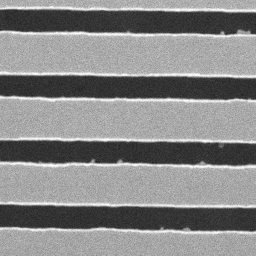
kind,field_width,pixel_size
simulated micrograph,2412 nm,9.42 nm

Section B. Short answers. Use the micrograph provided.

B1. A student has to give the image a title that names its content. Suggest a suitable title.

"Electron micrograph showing lines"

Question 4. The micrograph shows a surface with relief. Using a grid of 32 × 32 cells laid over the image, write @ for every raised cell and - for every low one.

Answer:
@@@@@@@@@@@@@@@@@@@@@@@@@@@@@@@@
----------------------------@---
--------------------------------
--------------------------------
@@@@@@@@@@@@@@@@@@@@@@@@@@@@@@@@
@@@@@@@@@@@@@@@@@@@@@@@@@@@@@@@@
@@@@@@@@@@@@@@@@@@@@@@@@@@@@@@@@
@@@@@@@@@@@@@@@@@@@@@@@@@@@@@@@@
@@@@@@@@@@@@@@@@@@@@@@@@@@@@@@@@
--------------@@@@@@@@@@@@@@@@@@
--------------------------------
--------------------------------
@@@@@@@@@@@@@@@@@@@@@@@@@@--@@@-
@@@@@@@@@@@@@@@@@@@@@@@@@@@@@@@@
@@@@@@@@@@@@@@@@@@@@@@@@@@@@@@@@
@@@@@@@@@@@@@@@@@@@@@@@@@@@@@@@@
@@@@@@@@@@@@@@@@@@@@@@@@@@@@@@@@
@@@@@@@@@@@@@@@@@@@@@@@@@@@@@@@@
--------------------------------
--------------------------------
@@@@@@@-@@@@@-@@@@@-------------
@@@@@@@@@@@@@@@@@@@@@@@@@@@@@@@@
@@@@@@@@@@@@@@@@@@@@@@@@@@@@@@@@
@@@@@@@@@@@@@@@@@@@@@@@@@@@@@@@@
@@@@@@@@@@@@@@@@@@@@@@@@@@@@@@@@
@@@@@@@@@@@@@@@@@@@@@@@@@@@@@@@@
--------------------------------
--------------------------------
@@@-----------------------------
@@@@@@@@@@@@@@@@@@@@@@@@@@@@@@@@
@@@@@@@@@@@@@@@@@@@@@@@@@@@@@@@@
@@@@@@@@@@@@@@@@@@@@@@@@@@@@@@@@